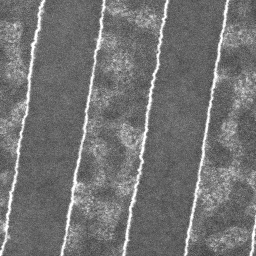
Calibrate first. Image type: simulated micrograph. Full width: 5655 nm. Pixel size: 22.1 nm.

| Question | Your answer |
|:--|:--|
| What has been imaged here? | one or a few lines or trenches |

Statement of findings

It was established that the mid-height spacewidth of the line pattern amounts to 1330 nm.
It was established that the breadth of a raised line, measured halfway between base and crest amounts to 1350 nanometres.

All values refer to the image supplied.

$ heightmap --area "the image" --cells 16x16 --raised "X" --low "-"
XXX---XXXX----XX
XX----XXXX----XX
XX----XXXX----XX
XX----XXXX----XX
XX----XXXX---XXX
XX----XXX----XXX
XX---XXXX----XXX
XX---XXXX----XXX
X----XXXX----XXX
X----XXXX----XXX
X----XXXX----XXX
X----XXXX---XXXX
X----XXX----XXXX
X---XXXX----XXXX
----XXXX----XXXX
----XXXX----XXXX